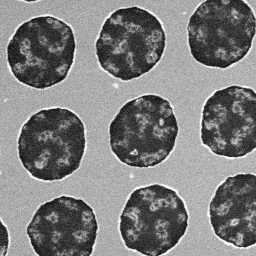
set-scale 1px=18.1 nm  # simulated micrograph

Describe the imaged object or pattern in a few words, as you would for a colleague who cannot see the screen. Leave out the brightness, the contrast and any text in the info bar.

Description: holes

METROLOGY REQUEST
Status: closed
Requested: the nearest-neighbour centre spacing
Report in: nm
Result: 1620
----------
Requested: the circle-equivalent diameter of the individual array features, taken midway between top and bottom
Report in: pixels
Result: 70.5